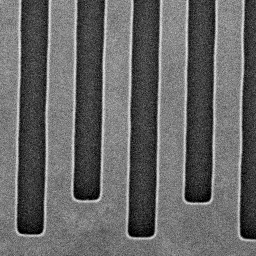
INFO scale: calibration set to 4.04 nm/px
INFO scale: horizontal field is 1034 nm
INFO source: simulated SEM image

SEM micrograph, groups of lines, slits or small figures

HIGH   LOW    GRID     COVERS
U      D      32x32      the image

UUUDDDUUUUDDDUUUUDDDUUUDDDDUUUDD
UUDDDDUUUUDDDUUUUDDDUUUDDDDUUUDD
UUDDDDUUUDDDDUUUDDDDUUUDDDDUUUDD
UUDDDDUUUDDDDUUUDDDDUUUDDDDUUUDD
UUDDDDUUUDDDDUUUDDDDUUUDDDDUUUDD
UUDDDDUUUDDDDUUUDDDDUUUDDDDUUUDD
UUDDDDUUUDDDDUUUDDDDUUUDDDDUUUDD
UUDDDDUUUDDDDUUUDDDDUUUDDDDUUUDD
UUDDDDUUUDDDDUUUDDDDUUUDDDDUUUDD
UUDDDDUUUDDDDUUUDDDDUUUDDDDUUUDD
UUDDDDUUUDDDDUUUDDDDUUUDDDDUUUDD
UUDDDDUUUDDDDUUUDDDDUUUDDDDUUUDD
UUDDDDUUUDDDDUUUDDDDUUUDDDDUUUDD
UUDDDDUUUDDDDUUUDDDDUUUDDDDUUUDD
UUDDDDUUUDDDDUUUDDDDUUUDDDDUUUDD
UUDDDDUUUDDDDUUUDDDDUUUDDDDUUUDD
UUDDDDUUUDDDDUUUDDDDUUUDDDDUUUDD
UUDDDDUUUDDDDUUUDDDDUUUDDDDUUUDD
UUDDDDUUUDDDDUUUDDDDUUUDDDDUUUDD
UUDDDDUUUDDDDUUUDDDDUUUDDDDUUUDD
UUDDDDUUUDDDDUUUDDDDUUUDDDDUUUDD
UUDDDDUUUDDDDUUUDDDDUUUDDDDUUUDD
UUDDDDUUUDDDDUUUDDDDUUUDDDDUUUDD
UUDDDDUUUDDDDUUUDDDDUUUDDDDUUUDD
UUDDDDUUUDDDDUUUDDDDUUUDDDUUUUDD
UUDDDDUUUUUUUUUUDDDDUUUUUUUUUUDD
UUDDDDUUUUUUUUUUDDDDUUUUUUUUUUDD
UUDDDDUUUUUUUUUUDDDDUUUUUUUUUUDD
UUDDDUUUUUUUUUUUDDDUUUUUUUUUUUDD
UUUUUUUUUUUUUUUUDDDUUUUUUUUUUUDD
UUUUUUUUUUUUUUUUUUUUUUUUUUUUUUUU
UUUUUUUUUUUUUUUUUUUUUUUUUUUUUUUU